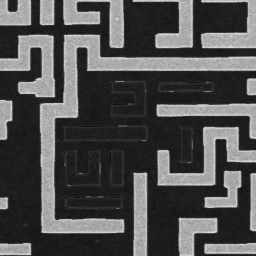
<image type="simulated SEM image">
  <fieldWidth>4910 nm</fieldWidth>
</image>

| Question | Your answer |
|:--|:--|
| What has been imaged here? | wiring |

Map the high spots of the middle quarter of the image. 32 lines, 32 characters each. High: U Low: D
UUUDDDUUUUUUUUUUUUUUUUUUUUUUUUUU
UUUDDDDDDDDDDDDDDDDDDDDDDDDDDDDD
UUUDDDDDDDDDDDDDDDDDDDDDDDDDDDDD
UUUDDDDDDDDDDDDDDDDDDDDDDDDDDDDD
UUUDDDDDDDDDDDDDDDDDDDDDDDDDDDDD
UUUDDDDDDDDDUUUUUUUUDDDDUUUUUUUU
UUUDDDDDDDDDUUUUUUUUDDDDUUUUUUUU
UUUDDDDDDDDDDDDDDUUUDDDDDDDDDDDD
UUUDDDDDDDDDDDDDDDUUDDDDDDDDDDDD
UUUDDDDDDDDDDDDDDDUUDDDDDDDDDDDD
UUUDDDDDDDDDUUUUUUUUDDDDUUUUUUUU
UUUDDDDDDDDDUUUUUUUUDDDUUUUUUUUU
UUUDDDDDDDDDUUUUUUUUDDDUUUUUUUUU
DDDDDDDDDDDDDDDDDDDDDDDDDDDDDDDD
DDDDDDDDDDDDDDDDDDDDDDDDDDDDDDDD
DDDDDDDDDDDDDDDDDDDDDDDDDDDDDDDD
UUUUUUUUUUUUUUUUUUUUUDDDDDDDDUUU
UUUUUUUUUUUUUUUUUUUUUDDDDDDDDUUU
UUUUUUUUUUUUUUUUUUUUUDDDDDDDDUUU
DDDDDDDDDDDDDDDDDDDDDDDDDDDDDUUU
DDDDDDDDDDDDDDDDDDDDDDDDDDDDDUUU
DDDDDDDDDDDDDDDDDDDDDDDDDDDDDUUU
UUUDDDUUUDDDUUUDDDDDDDDDUUDDDUUU
UUUDDDUUUDDDUUUDDDDDDDDDUUDDDUUU
UUUDDDUUUDDDUUUDDDDDDDDDUUDDDDDD
UUUDDDUUUDDDUUUDDDDDDDDDUUDDDDDD
DUUDDDUUUDDDUUUDDDDDDDDDUUDDDDDD
DUUDDDUUUDDDUUUDDDUUDDDDUUUDDDDD
DUUUUUUUUDDDUUUDDDUUDDDDUUUUUUUU
DUUUUUUUUDDDUUUDDDUUDDDDUUUUUUUU
DDDDDDDDDDDDDDDDDDUUDDDDDDDDDDDD
DDDDDDDDDDDDDDDDDDUUDDDDDDDDDDDD